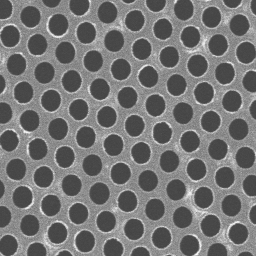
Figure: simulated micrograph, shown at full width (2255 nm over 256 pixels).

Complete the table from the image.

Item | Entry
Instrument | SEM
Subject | a regular array of holes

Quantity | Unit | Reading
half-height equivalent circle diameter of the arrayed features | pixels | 20.9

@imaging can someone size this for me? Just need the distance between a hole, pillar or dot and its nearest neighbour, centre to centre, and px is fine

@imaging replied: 28.6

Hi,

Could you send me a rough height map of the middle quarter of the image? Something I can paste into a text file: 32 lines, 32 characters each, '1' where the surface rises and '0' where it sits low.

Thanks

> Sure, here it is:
11111000001100000111101110001110
10111100011100000110000111111110
00001111111100001110000011111111
00001111111100001110000011000011
00001110000111111110000111000001
00001110000111111111000111000001
00011100000011000011111111000011
11111110000111000011111111100011
11111111001110000011100001111111
11000011111111000011000001111011
10000011110111000111000000110000
10000011100001111111000001100000
10000011000001111111100011100000
11000111000001110001111111110000
01111111100001100000111111110001
01111111100011100000111000111111
01110001111111100000110000011111
01100000111101110001110000011100
11100000110000111111110000011000
11100000110000011110111000111000
01110001110000011000011111111000
00111111110000011000001111111100
00011111111000111000001100001111
00011000011111111000001100000111
00111000001111111100011100000110
00111000001100001111111100000110
11111000011100000111111110001110
11111100011100000110000111111110
00001111111100001110000111111111
00001111111100001100000011000011
00001110000111111110000111000011
00001100000111111111001111000001